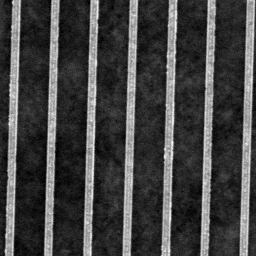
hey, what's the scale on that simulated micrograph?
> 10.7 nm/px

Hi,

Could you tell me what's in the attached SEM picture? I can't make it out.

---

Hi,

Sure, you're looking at parallel lines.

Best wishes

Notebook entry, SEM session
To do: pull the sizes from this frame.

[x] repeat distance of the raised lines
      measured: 417 nm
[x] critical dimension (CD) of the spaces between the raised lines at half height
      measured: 351 nanometers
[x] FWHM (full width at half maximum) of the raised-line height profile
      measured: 0.0681 µm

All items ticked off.